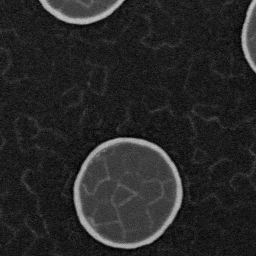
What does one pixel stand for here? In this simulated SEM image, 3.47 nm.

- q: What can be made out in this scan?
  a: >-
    raised bodies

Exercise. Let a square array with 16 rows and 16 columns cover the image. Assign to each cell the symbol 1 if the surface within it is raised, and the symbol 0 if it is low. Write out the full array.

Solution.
0001111000000000
0000000000000001
0000000000000001
0000000000000001
0000000000000000
0000000000000000
0000000000000000
0000000000000000
0000000000000000
0000001111000000
0000011111100000
0000011111100000
0000011111100000
0000011111100000
0000001111000000
0000000000000000